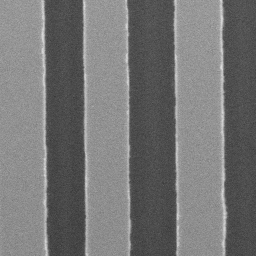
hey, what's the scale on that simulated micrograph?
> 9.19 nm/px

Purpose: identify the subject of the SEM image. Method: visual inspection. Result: lines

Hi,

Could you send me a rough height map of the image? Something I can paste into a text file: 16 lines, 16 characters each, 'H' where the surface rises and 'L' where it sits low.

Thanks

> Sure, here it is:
HHHLLHHHLLLHHHLL
HHHLLHHHLLLHHHLL
HHHLLHHHLLLHHHLL
HHHLLHHHLLLHHHLL
HHHLLHHHLLLHHHLL
HHHLLHHHLLLHHHLL
HHHLLHHHLLLHHHLL
HHHLLHHHLLLHHHLL
HHHLLHHHLLLHHHLL
HHHLLHHHLLLHHHLL
HHHLLHHHLLLHHHLL
HHHLLHHHLLLHHHLL
HHHLLHHHLLLHHHLL
HHHLLHHHLLLHHHLL
HHHLLHHHLLLHHHLL
HHHLLHHHLLLHHHLL